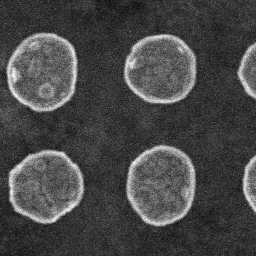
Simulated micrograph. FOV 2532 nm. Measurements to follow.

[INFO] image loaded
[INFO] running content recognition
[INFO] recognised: raised bodies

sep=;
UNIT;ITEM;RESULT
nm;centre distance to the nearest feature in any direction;1140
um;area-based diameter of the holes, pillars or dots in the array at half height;0.698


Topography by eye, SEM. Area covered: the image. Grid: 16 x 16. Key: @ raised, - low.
----------------
----------------
--@@-----@@-----
-@@@@---@@@@---@
-@@@@---@@@@---@
-@@@@---@@@@---@
--@@------------
----------------
----------------
---------@@-----
-@@@@---@@@@----
-@@@@---@@@@---@
-@@@@---@@@@----
--@@-----@@-----
----------------
----------------